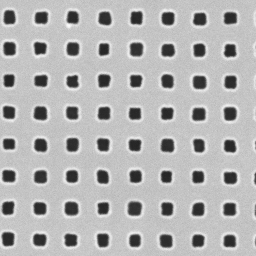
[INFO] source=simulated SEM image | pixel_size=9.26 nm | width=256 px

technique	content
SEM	a regular array of holes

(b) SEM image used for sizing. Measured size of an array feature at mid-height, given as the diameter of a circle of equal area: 0.13 µm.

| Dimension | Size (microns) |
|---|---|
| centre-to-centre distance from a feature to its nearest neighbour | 0.289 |